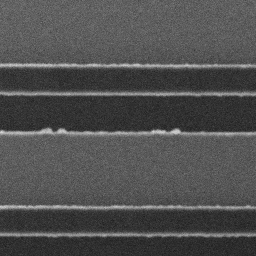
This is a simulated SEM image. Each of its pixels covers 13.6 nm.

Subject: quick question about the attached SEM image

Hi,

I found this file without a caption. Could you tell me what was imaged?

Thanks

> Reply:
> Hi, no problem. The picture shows lines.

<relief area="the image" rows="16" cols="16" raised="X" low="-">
XXXXXXXXXXXXXXXX
XXXXXXXXXXXXXXXX
XXXXXXXXXXXXXXXX
XXXXXXXXXXXXXXXX
XXXXXXXXXXXXXXXX
XXXXXXXXXXXXXXXX
----------------
----------------
XXXXXXXXXXXXXXXX
XXXXXXXXXXXXXXXX
XXXXXXXXXXXXXXXX
XXXXXXXXXXXXXXXX
XXXXXXXXXXXXXXXX
XXXXXXXXXXXXXXXX
XXXXXXXXXXXXXXXX
----------------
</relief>